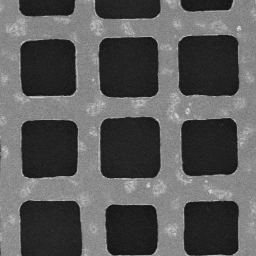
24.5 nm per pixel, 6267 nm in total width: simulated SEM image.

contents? holes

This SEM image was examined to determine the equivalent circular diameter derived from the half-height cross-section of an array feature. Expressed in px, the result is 64.9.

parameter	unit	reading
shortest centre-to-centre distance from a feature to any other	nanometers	1950